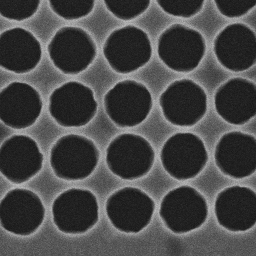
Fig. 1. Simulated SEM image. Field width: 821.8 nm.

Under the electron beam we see a regular array of holes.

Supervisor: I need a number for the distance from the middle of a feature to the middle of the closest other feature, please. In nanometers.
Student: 170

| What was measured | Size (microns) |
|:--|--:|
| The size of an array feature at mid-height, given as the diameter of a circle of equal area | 0.144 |